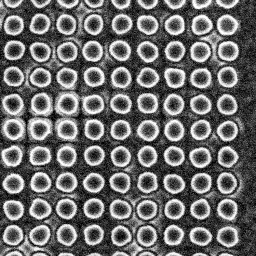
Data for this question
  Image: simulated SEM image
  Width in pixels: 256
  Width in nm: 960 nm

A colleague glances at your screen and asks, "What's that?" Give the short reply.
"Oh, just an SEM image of a regular array of raised bodies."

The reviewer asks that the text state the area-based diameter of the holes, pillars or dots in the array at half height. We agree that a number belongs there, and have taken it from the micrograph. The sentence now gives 0.0743 microns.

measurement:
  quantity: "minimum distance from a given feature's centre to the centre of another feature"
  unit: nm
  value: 97